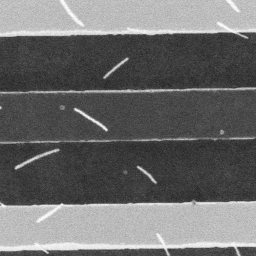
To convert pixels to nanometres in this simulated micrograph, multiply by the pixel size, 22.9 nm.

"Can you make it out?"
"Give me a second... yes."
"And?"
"lines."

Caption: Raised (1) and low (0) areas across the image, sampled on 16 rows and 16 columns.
1111111111111111
1111111111111111
0000000000000000
0000000000000000
0000000000000000
0000000000000000
1111111111111111
1111111111111111
1111111111111111
0000000000000000
0000000000000000
0000000000000000
0000000000000000
1111111111111111
1111111111111111
1110000000000000